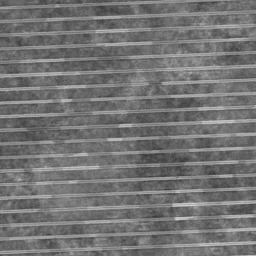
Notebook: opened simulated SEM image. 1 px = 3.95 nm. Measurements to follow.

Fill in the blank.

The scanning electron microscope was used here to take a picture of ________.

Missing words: parallel lines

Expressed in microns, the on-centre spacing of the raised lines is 0.0537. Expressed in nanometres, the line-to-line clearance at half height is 44.4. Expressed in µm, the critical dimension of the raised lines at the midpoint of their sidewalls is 0.0069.